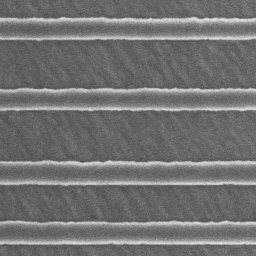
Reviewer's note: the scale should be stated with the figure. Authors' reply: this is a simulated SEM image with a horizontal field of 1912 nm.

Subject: lines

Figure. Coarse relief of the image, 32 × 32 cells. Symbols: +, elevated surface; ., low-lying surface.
................................
................................
++++++++++++++++++++++++++++++++
++++++++++++++++++++++++++++++++
++++++++++++++++++++++++++++++++
................................
................................
................................
................................
................................
................................
++++++++++++++++++++++++++++++++
++++++++++++++++++++++++++++++++
++++++++++++++++++++++++++++++++
................................
................................
................................
................................
................................
................................
++++++++++++++++++++++++++++++++
++++++++++++++++++++++++++++++++
++++++++++++++++++++++++++++++++
................................
................................
................................
................................
................................
++++++++++++++++++++++++++++++++
++++++++++++++++++++++++++++++++
................................
................................